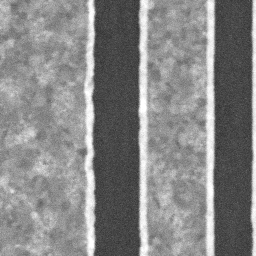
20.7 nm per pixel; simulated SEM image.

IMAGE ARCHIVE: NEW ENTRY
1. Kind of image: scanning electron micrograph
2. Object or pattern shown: one or a few lines or trenches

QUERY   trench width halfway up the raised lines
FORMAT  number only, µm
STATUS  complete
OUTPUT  1.11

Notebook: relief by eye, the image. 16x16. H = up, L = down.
HHHHHHLLLHHHHLLL
HHHHHHLLLHHHHLLL
HHHHHHLLLHHHHLLL
HHHHHHLLLHHHHLLL
HHHHHHLLLHHHHLLL
HHHHHLLLLHHHHLLL
HHHHHHLLLHHHHLLL
HHHHHHLLLHHHHLLL
HHHHHHLLLHHHHLLL
HHHHHHLLLHHHHLLL
HHHHHLLLLHHHHLLL
HHHHHHLLLHHHHLLL
HHHHHHLLLHHHHLLL
HHHHHHLLLHHHHLLL
HHHHHHLLLHHHHLLL
HHHHHHLLLHHHHLLL